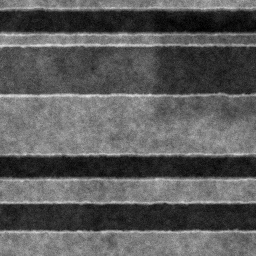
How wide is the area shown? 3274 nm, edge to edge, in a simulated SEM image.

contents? lines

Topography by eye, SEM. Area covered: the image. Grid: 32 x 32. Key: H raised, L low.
HHHHHHHHHHHHHHHHHHHHHHHHHHHHHHHH
LLLLLLLLLLLLLLLLLLLLLLLLLLLLLLLL
LLLLLLLLLLLLLLLLLLLLLLLLLLLLLLLL
LLLLLLLLLLLLLLLLLLLLLLLLLLLLLLLL
HHHHHHHHHHHHHHHHHHHHHHHHHHHHHHHH
HHHHHHHHHHHHHHHHHHHHHHHHHHHHHHHH
LLLLLLLLLLLLLLLLLLLLLLLLLLLLLLLL
LLLLLLLLLLLLLLLLLLLLLLLLLLLLLLLL
LLLLLLLLLLLLLLLLLLLLLLLLLLLLLLLL
LLLLLLLLLLLLLLLLLLLLLLLLLLLLLLLL
LLLLLLLLLLLLLLLLLLLLLLLLLLLLLLLL
LLLLLLLLLLLLLLLLLLLLLLLLLLLLLLLL
HHHHHHHHHHHHHHHHHHHHHHHHHHHHHHHH
HHHHHHHHHHHHHHHHHHHHHHHHHHHHHHHH
HHHHHHHHHHHHHHHHHHHHHHHHHHHHHHHH
HHHHHHHHHHHHHHHHHHHHHHHHHHHHHHHH
HHHHHHHHHHHHHHHHHHHHHHHHHHHHHHHH
HHHHHHHHHHHHHHHHHHHHHHHHHHHHHHHH
HHHHHHHHHHHHHHHHHHHHHHHHHHHHHHHH
LLLLLLLLLLLLLLLLLLLLLLLLLLLLLLLL
LLLLLLLLLLLLLLLLLLLLLLLLLLLLLLLL
LLLLLLLLLLLLLLLLLLLLLLLLLLLLLLLL
HLLLLHHLHHHHHHHLLLHHHHLHLLHLLHHH
HHHHHHHHHHHHHHHHHHHHHHHHHHHHHHHH
HHHHHHHHHHHHHHHHHHHHHHHHHHHHHHHH
LLLLLLLLLLLLLLLLLLLLLLLLLLLLLLLL
LLLLLLLLLLLLLLLLLLLLLLLLLLLLLLLL
LLLLLLLLLLLLLLLLLLLLLLLLLLLLLLLL
LLLLLLLLLLLLLLLLLLLLLLLLLLLLLLLL
HHHHHHHHHHHHHHHHHHHHHHHHHHHHHHHH
HHHHHHHHHHHHHHHHHHHHHHHHHHHHHHHH
HHHHHHHHHHHHHHHHHHHHHHHHHHHHHHHH